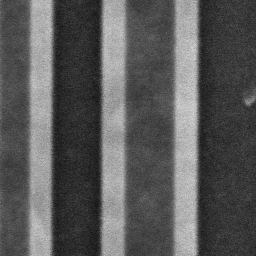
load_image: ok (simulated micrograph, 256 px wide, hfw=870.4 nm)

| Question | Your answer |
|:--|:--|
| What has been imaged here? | one or a few lines or trenches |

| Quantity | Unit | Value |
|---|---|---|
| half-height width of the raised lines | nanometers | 249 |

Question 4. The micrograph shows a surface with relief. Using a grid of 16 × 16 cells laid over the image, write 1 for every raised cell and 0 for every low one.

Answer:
1110000111110000
1110000111110000
1110000111110000
1110000111110000
1110000111110000
1110000111110000
1110000111110000
1110000111110000
1110000111110000
1110000111110000
1110000111110000
1110000111110000
1100000111110000
1100000111110000
1100000111110000
1100000111110000